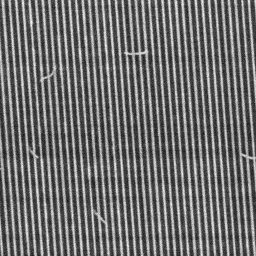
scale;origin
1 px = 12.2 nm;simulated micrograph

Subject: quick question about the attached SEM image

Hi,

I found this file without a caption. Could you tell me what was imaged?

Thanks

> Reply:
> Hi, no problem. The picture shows parallel lines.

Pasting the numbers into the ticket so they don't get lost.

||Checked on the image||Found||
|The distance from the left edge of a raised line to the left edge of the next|81.1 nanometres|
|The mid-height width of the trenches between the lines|4.62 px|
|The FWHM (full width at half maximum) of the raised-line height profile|0.0198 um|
